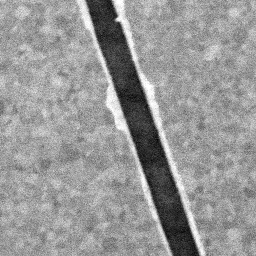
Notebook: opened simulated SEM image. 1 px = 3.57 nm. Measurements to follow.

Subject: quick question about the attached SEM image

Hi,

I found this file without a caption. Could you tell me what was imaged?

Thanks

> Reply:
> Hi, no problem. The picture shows one or a few lines or trenches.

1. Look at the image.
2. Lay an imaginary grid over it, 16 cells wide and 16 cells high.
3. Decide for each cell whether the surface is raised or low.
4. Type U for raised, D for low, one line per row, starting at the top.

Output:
UUUUUDDUUUUUUUUU
UUUUUUDDUUUUUUUU
UUUUUUDDUUUUUUUU
UUUUUUDDUUUUUUUU
UUUUUUUDDUUUUUUU
UUUUUUUDDUUUUUUU
UUUUUUUDDUUUUUUU
UUUUUUUUDDUUUUUU
UUUUUUUUDDUUUUUU
UUUUUUUUDDUUUUUU
UUUUUUUUUDDUUUUU
UUUUUUUUUDDUUUUU
UUUUUUUUUDDUUUUU
UUUUUUUUUUDDUUUU
UUUUUUUUUUDDUUUU
UUUUUUUUUUDDUUUU